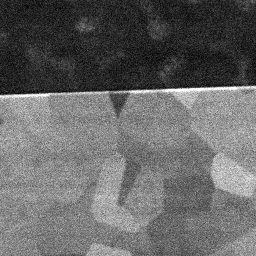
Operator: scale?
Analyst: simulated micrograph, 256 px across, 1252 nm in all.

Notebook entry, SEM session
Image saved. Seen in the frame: one or a few lines or trenches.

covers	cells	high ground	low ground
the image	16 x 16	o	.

................
................
................
................
................
..............oo
oooooooooooooooo
oooooooooooooooo
oooooooooooooooo
oooooooooooooooo
oooooooooooooooo
oooooooooooooooo
oooooooooooooooo
oooooooooooooooo
oooooooooooooooo
oooooooooooooooo